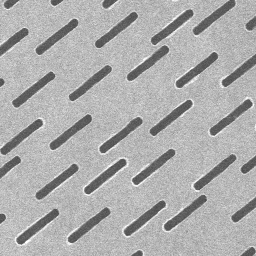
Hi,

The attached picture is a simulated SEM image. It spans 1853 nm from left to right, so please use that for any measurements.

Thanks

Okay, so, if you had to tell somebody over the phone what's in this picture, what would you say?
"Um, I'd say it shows a regular array of holes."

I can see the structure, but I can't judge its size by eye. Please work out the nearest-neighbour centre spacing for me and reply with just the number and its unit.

350 nm